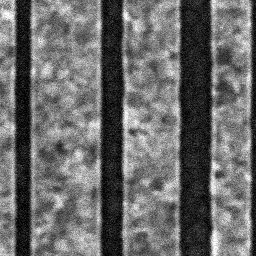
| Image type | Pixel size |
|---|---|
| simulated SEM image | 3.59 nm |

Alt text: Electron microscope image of one or a few lines or trenches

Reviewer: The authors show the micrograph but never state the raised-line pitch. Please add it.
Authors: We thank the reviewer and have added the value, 297 nanometres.